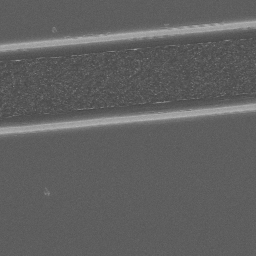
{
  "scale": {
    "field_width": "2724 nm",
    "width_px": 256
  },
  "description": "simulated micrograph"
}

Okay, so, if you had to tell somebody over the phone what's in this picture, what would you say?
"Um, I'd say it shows one or a few lines or trenches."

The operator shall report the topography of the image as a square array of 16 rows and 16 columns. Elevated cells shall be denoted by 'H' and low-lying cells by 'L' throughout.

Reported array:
HHHHHHHHHHHHHHHH
HHHHHHHHHHHHHHHH
HHHHHHLLLLLLLLLL
LLLLLLLLLLLLLLLL
LLLLLLLLLLLLLLLL
LLLLLLLLLLLLLLLL
LLLLLLLLLLLLLLLL
LLLLLLLHHHHHHHHH
HHHHHHHHHHHHHHHH
HHHHHHHHHHHHHHHH
HHHHHHHHHHHHHHHH
HHHHHHHHHHHHHHHH
HHHHHHHHHHHHHHHH
HHHHHHHHHHHHHHHH
HHHHHHHHHHHHHHHH
HHHHHHHHHHHHHHHH